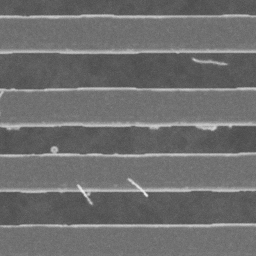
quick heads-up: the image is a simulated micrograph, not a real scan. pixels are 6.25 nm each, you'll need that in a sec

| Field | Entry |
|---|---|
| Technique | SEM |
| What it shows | lines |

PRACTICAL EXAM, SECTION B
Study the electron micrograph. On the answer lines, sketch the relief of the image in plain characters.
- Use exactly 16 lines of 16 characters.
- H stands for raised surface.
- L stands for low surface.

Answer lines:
LLLLLLLLLLLLLLLL
HHHHHHHHHHHHHHHH
HHHHHHHHHHHHHHHH
LLLLLLLLLLLLLLLL
LLLLLLLLLLLLLLLL
LLLLLLLLLLLLLLLL
HHHHHHHHHHHHHHHH
HHHHHHHHHHHHHHHH
LLLLLLLLLLLLLLLL
LLLLLLLLLLLLLLLL
HHHHHHHHHHHHHHHH
HHHHHHHHHHHHHHHH
LLLLLLLLLLLLLLLL
LLLLLLLLLLLLLLLL
HHHHHHHHHHHHHHHH
HHHHHHHHHHHHHHHH